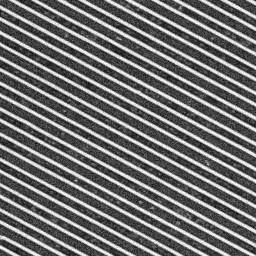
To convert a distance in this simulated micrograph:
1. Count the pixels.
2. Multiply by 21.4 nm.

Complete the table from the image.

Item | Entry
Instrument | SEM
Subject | parallel lines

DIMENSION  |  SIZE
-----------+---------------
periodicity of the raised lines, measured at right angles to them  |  478 nm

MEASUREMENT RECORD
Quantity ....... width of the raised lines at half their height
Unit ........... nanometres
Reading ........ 212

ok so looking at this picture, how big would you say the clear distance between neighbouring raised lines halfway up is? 12.6 pixels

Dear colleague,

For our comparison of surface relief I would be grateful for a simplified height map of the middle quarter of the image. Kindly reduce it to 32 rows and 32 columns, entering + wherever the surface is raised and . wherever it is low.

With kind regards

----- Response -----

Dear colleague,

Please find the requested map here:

......+++++.......+++++.......++
+.......+++++.......+++++.......
+++.......+++++.......+++++.....
+++++......++++++.......+++++...
..+++++.......+++++.......+++++.
....+++++.......+++++.......++++
......+++++.......+++++.......++
+.......+++++......+++++.......+
+++......+++++.......+++++......
++++.......+++++.......+++++....
.+++++.......+++++.......+++++..
...+++++.......+++++.......+++++
.....+++++.......+++++......++++
.......+++++.......+++++......++
++.......+++++.......+++++......
++++.......+++++......+++++.....
+++++.......+++++.......+++++...
..+++++.......+++++.......+++++.
....+++++.......+++++.......++++
......+++++.......+++++.......++
+.......+++++.......+++++.......
+++.......+++++.......+++++.....
+++++.......+++++.......+++++...
..+++++.......+++++......+++++..
...+++++.......+++++.......+++++
.....+++++.......+++++.......+++
+......++++++......+++++.......+
+++.......+++++......+++++......
++++.......+++++.......+++++....
.+++++.......+++++.......+++++..
...+++++.......+++++.......+++++
.....+++++.......+++++......++++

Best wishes